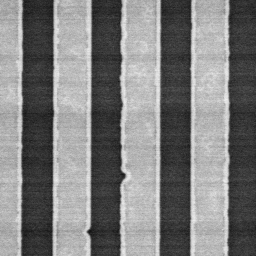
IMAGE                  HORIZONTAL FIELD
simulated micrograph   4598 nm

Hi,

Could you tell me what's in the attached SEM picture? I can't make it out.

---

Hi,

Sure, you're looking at one or a few lines or trenches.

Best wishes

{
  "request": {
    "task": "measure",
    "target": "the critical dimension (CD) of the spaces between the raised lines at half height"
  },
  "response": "640 nm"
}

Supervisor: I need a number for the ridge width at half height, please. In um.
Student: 0.595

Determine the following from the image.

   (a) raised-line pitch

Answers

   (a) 68.9 px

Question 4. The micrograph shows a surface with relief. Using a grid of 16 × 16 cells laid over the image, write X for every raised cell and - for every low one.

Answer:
X--XXX--XX--XX--
X--XXX--XX--XX--
X---XX--XX--XX--
X---XX--XX--XX--
X---XX--XX--XX--
X--XXX--XX--XX--
X--XXX--XX--XX--
X--XXX--XX--XX--
X--XXX--XX--XX--
X--XXX--XX--XX--
X--XXX--XX--XX--
X--XX---XX--XX--
X--XX---XX--XX--
X--XX---XX--XX--
X--XX---XX--XX--
X--XX---XX--XX--